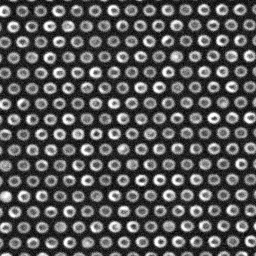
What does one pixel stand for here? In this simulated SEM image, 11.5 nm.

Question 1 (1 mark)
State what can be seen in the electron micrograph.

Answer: a regular array of raised bodies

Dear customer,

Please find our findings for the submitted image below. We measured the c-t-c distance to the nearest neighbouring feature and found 17.6 pixels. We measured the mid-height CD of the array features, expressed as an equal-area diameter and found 120 nm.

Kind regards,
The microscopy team